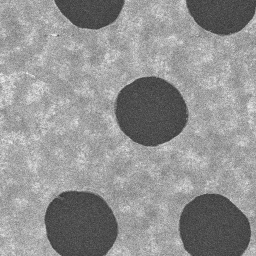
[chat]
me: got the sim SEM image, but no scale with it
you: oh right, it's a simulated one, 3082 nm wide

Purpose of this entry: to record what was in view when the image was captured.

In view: holes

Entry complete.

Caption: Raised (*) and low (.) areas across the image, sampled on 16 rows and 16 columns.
****....****....
*****..*****...*
****************
****************
****************
********...*****
*******.....****
*******.....****
********...*****
****************
****************
****************
***...******..**
***....****....*
***....****.....
***....*****...*